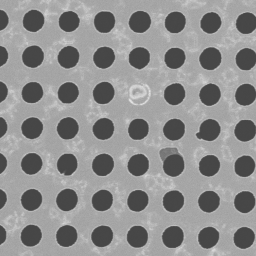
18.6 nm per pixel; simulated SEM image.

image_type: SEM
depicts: a regular array of holes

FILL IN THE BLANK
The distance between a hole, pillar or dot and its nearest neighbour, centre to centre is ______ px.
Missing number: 35.4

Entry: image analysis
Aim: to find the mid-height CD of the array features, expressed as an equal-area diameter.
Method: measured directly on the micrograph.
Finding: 407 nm